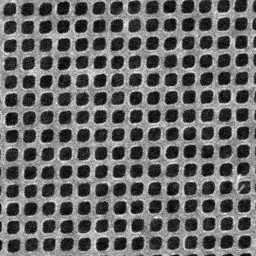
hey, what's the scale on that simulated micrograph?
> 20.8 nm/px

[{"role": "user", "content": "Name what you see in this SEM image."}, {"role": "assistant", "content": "a regular array of holes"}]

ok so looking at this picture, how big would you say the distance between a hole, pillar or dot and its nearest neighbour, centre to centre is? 0.367 µm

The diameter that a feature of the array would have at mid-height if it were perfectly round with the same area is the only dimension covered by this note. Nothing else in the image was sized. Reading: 305 nm